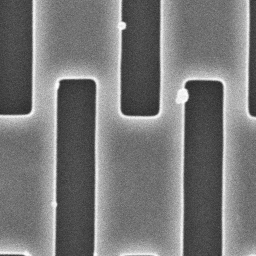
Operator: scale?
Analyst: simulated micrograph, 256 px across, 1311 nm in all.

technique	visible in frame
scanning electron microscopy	groups of lines, slits or small figures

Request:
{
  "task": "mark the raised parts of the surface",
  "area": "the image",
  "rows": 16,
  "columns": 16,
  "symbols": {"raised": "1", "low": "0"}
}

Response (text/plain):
0011111100111111
0011111100111111
0011111100111110
0011111100111110
0011111000111110
0011001000110010
0011001000110010
1110001111100011
1110001111100011
1110001111100011
1110001111100011
1110001111100011
1110001111100011
1110001111100011
1110001111100011
1110001111100011